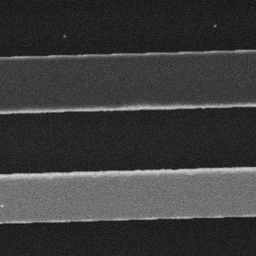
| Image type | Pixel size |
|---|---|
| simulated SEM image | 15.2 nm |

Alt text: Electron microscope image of lines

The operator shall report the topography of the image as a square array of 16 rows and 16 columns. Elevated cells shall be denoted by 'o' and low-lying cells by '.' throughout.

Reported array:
................
................
................
...ooooooooooooo
oooooooooooooooo
oooooooooooooooo
oooooooooooooooo
................
................
................
...............o
oooooooooooooooo
oooooooooooooooo
oooooooooooooooo
................
................